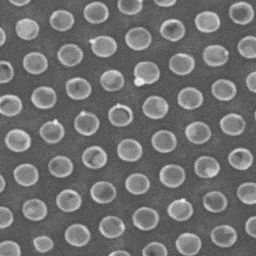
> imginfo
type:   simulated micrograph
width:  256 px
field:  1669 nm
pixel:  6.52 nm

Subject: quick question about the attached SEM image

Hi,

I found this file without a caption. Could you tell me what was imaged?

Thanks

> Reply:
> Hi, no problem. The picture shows a regular array of raised bodies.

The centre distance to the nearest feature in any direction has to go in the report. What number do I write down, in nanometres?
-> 228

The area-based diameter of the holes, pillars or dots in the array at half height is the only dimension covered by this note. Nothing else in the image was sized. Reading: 146 nm